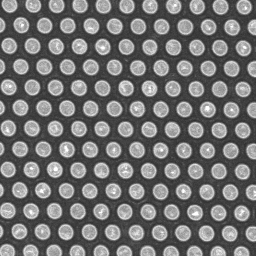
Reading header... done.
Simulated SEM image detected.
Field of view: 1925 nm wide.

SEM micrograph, a regular array of raised bodies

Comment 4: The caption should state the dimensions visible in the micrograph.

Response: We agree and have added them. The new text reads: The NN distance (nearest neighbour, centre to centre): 175 nm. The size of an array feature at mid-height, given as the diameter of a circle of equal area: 0.118 µm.